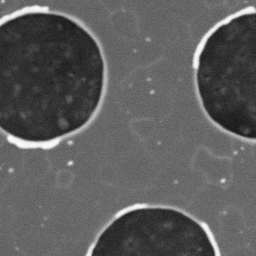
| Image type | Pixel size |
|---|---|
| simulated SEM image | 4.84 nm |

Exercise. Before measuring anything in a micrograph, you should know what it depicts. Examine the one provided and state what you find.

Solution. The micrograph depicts holes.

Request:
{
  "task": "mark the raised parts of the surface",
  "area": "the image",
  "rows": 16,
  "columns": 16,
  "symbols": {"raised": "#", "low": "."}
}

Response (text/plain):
################
.....#########..
......#######...
......#######...
.......#####....
......######....
......#######...
......#######...
#...###########.
################
################
################
################
########....####
######.......###
######.......###